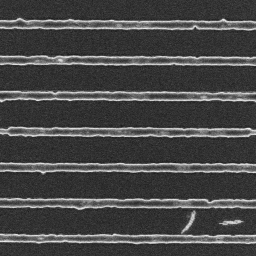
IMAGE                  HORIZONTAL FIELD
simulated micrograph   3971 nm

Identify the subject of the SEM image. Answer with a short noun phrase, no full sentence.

parallel lines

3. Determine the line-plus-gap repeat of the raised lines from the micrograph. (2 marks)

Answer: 554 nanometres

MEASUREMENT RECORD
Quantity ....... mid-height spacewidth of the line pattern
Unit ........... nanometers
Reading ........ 438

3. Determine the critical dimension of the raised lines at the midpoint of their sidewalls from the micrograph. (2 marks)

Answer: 116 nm